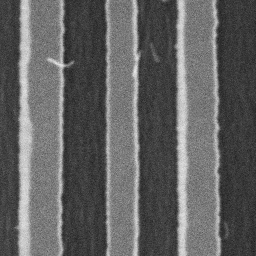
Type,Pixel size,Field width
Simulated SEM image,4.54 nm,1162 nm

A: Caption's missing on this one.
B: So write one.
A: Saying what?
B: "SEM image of lines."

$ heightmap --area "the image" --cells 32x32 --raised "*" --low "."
...*****.....****.....*****.....
...*****.....****.....*****.....
...*****.....****.....*****.....
...*****.....****.....*****.....
...*****.....****.....*****.....
...*****.....****.....*****.....
...*****.....****.....*****.....
...*****.....****.....*****.....
...*****.....****.....*****.....
...*****.....****.....*****.....
...*****.....****.....*****.....
...*****.....****......****.....
...*****.....****......****.....
...*****.....****......****.....
...*****.....****......****.....
...*****.....****.....*****.....
...*****.....****.....*****.....
...*****.....****......****.....
...*****.....****.....*****.....
...*****.....****......****.....
...*****.....****......****.....
...*****.....****......****.....
...*****.....****......****.....
...*****.....****.....*****.....
...*****.....****......****.....
...*****.....****......****.....
...*****.....****......****.....
...*****.....****......****.....
...*****.....****......****.....
...*****.....****......****.....
...*****.....****......****.....
...*****.....****......****.....